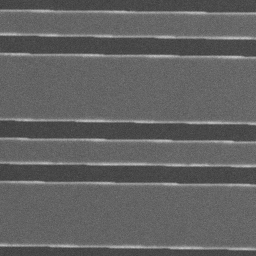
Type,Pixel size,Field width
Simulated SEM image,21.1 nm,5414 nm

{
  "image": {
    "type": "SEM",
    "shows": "lines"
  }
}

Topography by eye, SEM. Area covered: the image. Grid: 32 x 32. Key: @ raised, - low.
--------------------------------
@@@@@@@@@@@@@@@@----------------
@@@@@@@@@@@@@@@@@@@@@@@@@@@@@@@@
@@@@@@@@@@@@@@@@@@@@@@@@@@@@@@@@
-------------@@@@@@@@@@@@@@@@@@@
--------------------------------
--------------------------------
@@@@@@@@@@@@@@@@@@@@@@@@@@@@@@@@
@@@@@@@@@@@@@@@@@@@@@@@@@@@@@@@@
@@@@@@@@@@@@@@@@@@@@@@@@@@@@@@@@
@@@@@@@@@@@@@@@@@@@@@@@@@@@@@@@@
@@@@@@@@@@@@@@@@@@@@@@@@@@@@@@@@
@@@@@@@@@@@@@@@@@@@@@@@@@@@@@@@@
@@@@@@@@@@@@@@@@@@@@@@@@@@@@@@@@
@@@@@@@@@@@@@@@@@@@@@@@@@@@@@@@@
-------------------------------@
--------------------------------
@@@@@@@@@@@@@@------------------
@@@@@@@@@@@@@@@@@@@@@@@@@@@@@@@@
@@@@@@@@@@@@@@@@@@@@@@@@@@@@@@@@
------------@@@@@@@@@@@@@@@@@@@@
--------------------------------
--------------------------------
@@@@@@@@@@@@@@@@@@@@@@@@@@@@@@@@
@@@@@@@@@@@@@@@@@@@@@@@@@@@@@@@@
@@@@@@@@@@@@@@@@@@@@@@@@@@@@@@@@
@@@@@@@@@@@@@@@@@@@@@@@@@@@@@@@@
@@@@@@@@@@@@@@@@@@@@@@@@@@@@@@@@
@@@@@@@@@@@@@@@@@@@@@@@@@@@@@@@@
@@@@@@@@@@@@@@@@@@@@@@@@@@@@@@@@
@@@@@@@@@@@@@@@@@@@@@@@@@@@@@@@@
--------------------------------